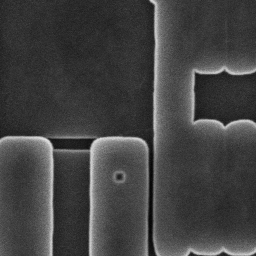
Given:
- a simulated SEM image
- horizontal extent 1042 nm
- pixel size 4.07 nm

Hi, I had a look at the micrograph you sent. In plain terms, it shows wiring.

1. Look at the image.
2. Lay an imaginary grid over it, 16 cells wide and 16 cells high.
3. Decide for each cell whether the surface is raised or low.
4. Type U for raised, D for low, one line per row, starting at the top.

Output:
DDDDDDDDDDUUUUUU
DDDDDDDDDDUUUUUU
DDDDDDDDDDUUUUUU
DDDDDDDDDDUUUUUU
DDDDDDDDDDUUUUUU
DDDDDDDDDDUUDDDD
DDDDDDDDDDUUDDDD
DDDDDDDDDDUUUDDD
DDDDDDDDDDUUUUUU
UUUDDDUUUUUUUUUU
UUUDDDUUUUUUUUUU
UUUDDDUUUUUUUUUU
UUUDDDUUUUUUUUUU
UUUDDDUUUUUUUUUU
UUUDDDUUUUUUUUUU
UUUDDDUUUUUUUUUU